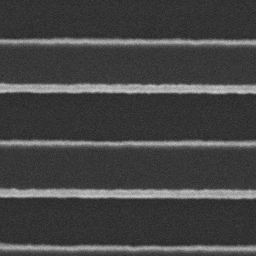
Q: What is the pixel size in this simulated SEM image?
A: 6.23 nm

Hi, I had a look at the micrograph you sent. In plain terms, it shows lines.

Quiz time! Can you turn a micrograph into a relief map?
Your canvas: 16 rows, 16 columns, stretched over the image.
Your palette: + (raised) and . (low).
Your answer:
................
................
................
++++++++++++++++
++++++++++++++++
++++++++++++++++
................
................
................
++++++++++++++++
++++++++++++++++
++++++++++++++++
................
................
................
+++.............